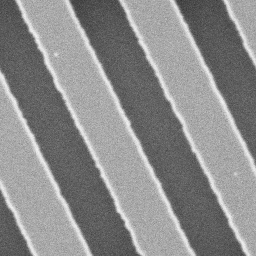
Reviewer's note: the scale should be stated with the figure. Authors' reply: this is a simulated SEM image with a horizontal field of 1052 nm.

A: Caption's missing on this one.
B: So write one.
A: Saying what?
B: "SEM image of lines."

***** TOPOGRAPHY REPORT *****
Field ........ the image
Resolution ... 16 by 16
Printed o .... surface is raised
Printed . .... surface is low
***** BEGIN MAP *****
.ooo....ooo...oo
..ooo...oooo...o
..ooo....ooo...o
...ooo...oooo...
...ooo....ooo...
....ooo...oooo..
o...ooo....ooo..
o....ooo...oooo.
oo...ooo....ooo.
oo....ooo...oooo
ooo...ooo....ooo
ooo....ooo...ooo
oooo...ooo....oo
.ooo....ooo...oo
.oooo...ooo....o
..ooo....ooo...o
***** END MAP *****